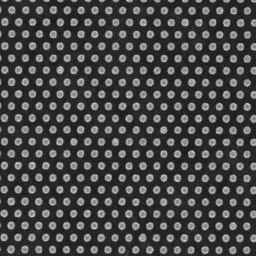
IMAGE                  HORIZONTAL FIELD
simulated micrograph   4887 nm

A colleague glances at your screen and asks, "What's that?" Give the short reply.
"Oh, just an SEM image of a regular array of raised bodies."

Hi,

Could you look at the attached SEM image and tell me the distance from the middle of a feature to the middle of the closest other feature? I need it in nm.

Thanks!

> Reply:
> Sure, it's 260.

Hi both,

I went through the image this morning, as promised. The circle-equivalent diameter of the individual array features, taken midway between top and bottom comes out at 6.96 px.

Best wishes